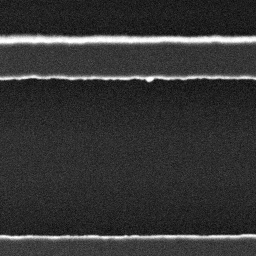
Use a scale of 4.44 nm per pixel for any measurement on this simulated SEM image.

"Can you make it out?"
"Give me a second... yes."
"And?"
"lines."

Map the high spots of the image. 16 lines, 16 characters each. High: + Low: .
................
................
++++++++++++++++
++++++++++++++++
++++++++++++++++
................
................
................
................
................
................
................
................
................
................
++++++++++++++++